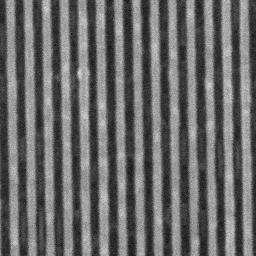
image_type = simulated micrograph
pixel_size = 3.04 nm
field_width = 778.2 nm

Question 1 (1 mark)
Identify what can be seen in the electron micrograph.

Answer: parallel lines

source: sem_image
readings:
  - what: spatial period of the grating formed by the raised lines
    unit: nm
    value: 54.6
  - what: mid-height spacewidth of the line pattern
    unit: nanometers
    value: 32.7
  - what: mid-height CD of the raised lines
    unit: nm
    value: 22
